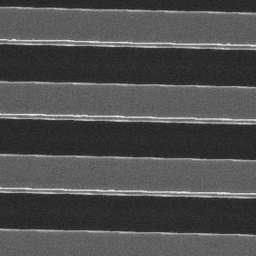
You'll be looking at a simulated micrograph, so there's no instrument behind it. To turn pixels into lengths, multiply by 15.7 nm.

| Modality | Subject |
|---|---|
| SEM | lines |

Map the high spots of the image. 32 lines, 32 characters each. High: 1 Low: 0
00000000000000000000000000000000
11111111111111111111100000000000
11111111111111111111111111111111
11111111111111111111111111111111
11111111111111111111111111111111
00011111111111111111111111111111
00000000000000000000000000000000
00000000000000000000000000000000
00000000000000000000000000000000
00000000000000000000000000000000
11111111110000000000000000000000
11111111111111111111111111111111
11111111111111111111111111111111
11111111111111111111111111111111
11111111111111111111111111111111
00000000000000000000000000000000
00000000000000000000000000000000
00000000000000000000000000000000
00000000000000000000000000000000
11111000000000000000000000000000
11111111111111111111111111111111
11111111111111111111111111111111
11111111111111111111111111111111
11111111111111111111111111111111
00000000000000000000000001111111
00000000000000000000000000000000
00000000000000000000000000000000
00000000000000000000000000000000
00000000000000000000000000000000
11111111111111111111111111111111
11111111111111111111111111111111
11111111111111111111111111111111